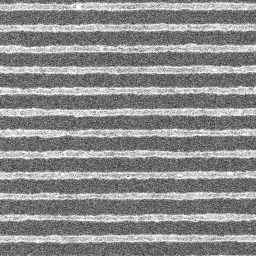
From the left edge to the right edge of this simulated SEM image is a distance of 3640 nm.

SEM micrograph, parallel lines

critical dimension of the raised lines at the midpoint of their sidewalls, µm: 0.231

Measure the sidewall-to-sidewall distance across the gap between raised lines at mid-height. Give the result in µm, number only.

0.064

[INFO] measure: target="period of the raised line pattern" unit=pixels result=21.1